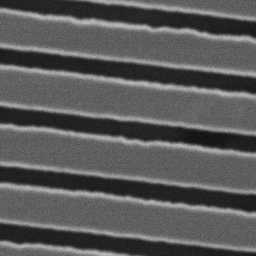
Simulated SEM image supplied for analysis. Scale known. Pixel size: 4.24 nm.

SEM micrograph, lines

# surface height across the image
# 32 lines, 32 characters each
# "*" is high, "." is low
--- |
.............*******************
***....................*********
************...................*
*********************...........
*****************************.*.
********************************
.....***************************
.............*******************
***...................**********
************...................*
********************............
*****************************...
********************************
..******************************
..........**********************
...................*************
*********...................****
****************................
***************************.....
********************************
********************************
........************************
.................***************
******...................*******
**************..................
**********************..........
*******************************.
********************************
......**************************
..............******************
**.*...................*********
*************...................